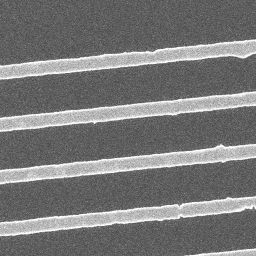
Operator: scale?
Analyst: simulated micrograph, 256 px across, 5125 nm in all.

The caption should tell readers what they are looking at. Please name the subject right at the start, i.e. parallel lines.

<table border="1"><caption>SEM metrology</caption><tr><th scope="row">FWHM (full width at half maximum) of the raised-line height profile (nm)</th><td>271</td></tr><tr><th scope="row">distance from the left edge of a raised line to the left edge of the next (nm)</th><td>1040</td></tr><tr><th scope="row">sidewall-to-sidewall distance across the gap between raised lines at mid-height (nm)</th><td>769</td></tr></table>